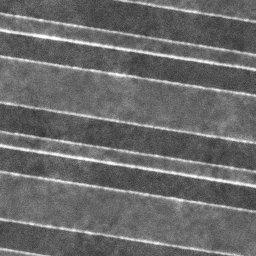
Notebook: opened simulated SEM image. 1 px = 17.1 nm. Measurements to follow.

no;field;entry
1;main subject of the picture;lines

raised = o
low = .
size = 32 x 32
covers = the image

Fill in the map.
..................oooooooooooooo
........................oooooooo
ooooo.........................oo
ooooooooooo.....................
.....oooooooooooo...............
...........ooooooooooooo........
..................oooooooooooo..
ooo.....................oooooooo
oooooooooo....................oo
ooooooooooooooooo...............
ooooooooooooooooooooooo.........
ooooooooooooooooooooooooooooo...
oooooooooooooooooooooooooooooooo
....oooooooooooooooooooooooooooo
..........oooooooooooooooooooooo
.................ooooooooooooooo
o......................ooooooooo
ooooooo......................ooo
.oooooooooooo...................
........oooooooooooo............
..............oooooooooooo......
....................oooooooooooo
ooooooo....................ooooo
oooooooooooooo..................
ooooooooooooooooooo.............
oooooooooooooooooooooooooo......
oooooooooooooooooooooooooooooooo
.ooooooooooooooooooooooooooooooo
.......ooooooooooooooooooooooooo
.............ooooooooooooooooooo
....................oooooooooooo
ooo........................ooooo